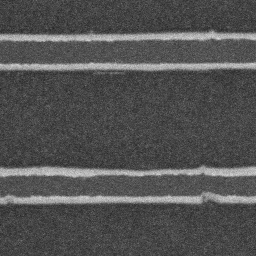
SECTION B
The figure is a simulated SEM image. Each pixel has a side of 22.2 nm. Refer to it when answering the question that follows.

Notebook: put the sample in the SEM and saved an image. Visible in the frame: one or a few lines or trenches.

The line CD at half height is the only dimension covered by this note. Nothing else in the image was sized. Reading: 656 nanometres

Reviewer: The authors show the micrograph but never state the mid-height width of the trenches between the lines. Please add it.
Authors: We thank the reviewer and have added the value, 2350 nanometers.